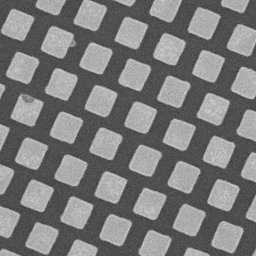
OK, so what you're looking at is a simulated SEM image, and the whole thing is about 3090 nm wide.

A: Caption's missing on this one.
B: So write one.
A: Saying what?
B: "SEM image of a regular array of raised bodies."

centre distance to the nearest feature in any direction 510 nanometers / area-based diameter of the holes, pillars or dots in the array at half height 352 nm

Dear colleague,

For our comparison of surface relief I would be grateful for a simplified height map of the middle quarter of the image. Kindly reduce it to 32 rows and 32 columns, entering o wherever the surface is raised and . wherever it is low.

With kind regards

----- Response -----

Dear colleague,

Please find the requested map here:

....ooooooo....oooooo...........
......oooo.....ooooooo..........
oo............ooooooo...........
ooo...........ooooooo.....oo....
ooo...........oooooo.....ooooo..
ooo.....o.......oooo.....oooooo.
oo.....ooooo......o.....ooooooo.
oo.....oooooo...........ooooooo.
o.....ooooooo..........ooooooo..
......ooooooo............ooooo..
.....ooooooo.....oooo......oo...
......oooooo.....oooooo.........
o.......ooo.....ooooooo.........
oooo............ooooooo.........
ooooo..........ooooooo.....ooo..
oooo...........ooooooo....oooooo
oooo.....oo.......ooo.....oooooo
ooo.....oooooo...........ooooooo
ooo.....oooooo...........ooooooo
.o.....ooooooo...........oooooo.
.......ooooooo.....o.......oooo.
.......oooooo.....ooooo.........
........ooooo.....oooooo........
ooo.......oo.....ooooooo........
ooooo............ooooooo........
oooooo..........ooooooo.....oooo
ooooo............oooooo.....oooo
ooooo.....oo........oo.....ooooo
oooo.....oooooo............ooooo
oooo.....ooooooo..........oooooo
..o.....ooooooo...........oooooo
........ooooooo.....oo.......ooo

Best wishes